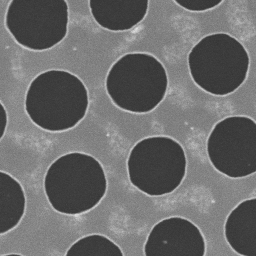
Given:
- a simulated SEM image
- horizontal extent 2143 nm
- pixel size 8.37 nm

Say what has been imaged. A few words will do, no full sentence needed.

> holes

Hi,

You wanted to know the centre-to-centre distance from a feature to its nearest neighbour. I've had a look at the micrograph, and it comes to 700 nm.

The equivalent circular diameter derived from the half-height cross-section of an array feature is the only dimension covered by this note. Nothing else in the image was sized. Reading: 502 nm